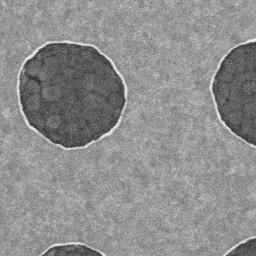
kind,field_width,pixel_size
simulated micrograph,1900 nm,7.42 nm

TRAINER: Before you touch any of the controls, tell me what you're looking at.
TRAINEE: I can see holes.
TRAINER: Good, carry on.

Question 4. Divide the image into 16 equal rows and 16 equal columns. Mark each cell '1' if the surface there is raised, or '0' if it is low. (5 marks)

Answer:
1111111111111111
1111111111111111
1111111111111111
1100000111111100
1000000111111100
1000000011111000
1000000011111000
1100000111111100
1110001111111110
1111111111111111
1111111111111111
1111111111111111
1111111111111111
1111111111111111
1111111111111111
1110001111111110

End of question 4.